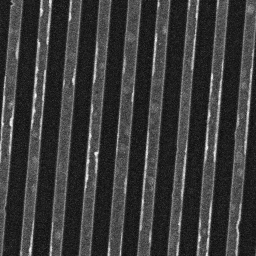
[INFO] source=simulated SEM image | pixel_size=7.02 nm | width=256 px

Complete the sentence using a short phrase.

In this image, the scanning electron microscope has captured parallel lines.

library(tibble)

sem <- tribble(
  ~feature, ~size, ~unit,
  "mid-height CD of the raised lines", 0.077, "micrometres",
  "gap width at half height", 0.129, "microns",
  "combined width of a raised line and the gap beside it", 206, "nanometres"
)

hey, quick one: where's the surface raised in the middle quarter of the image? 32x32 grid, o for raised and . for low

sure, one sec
ooo.....oo.....ooo....ooo.....oo
ooo.....oo.....ooo....ooo.....oo
ooo.....oo.....ooo....ooo.....oo
ooo....ooo.....ooo....ooo.....oo
ooo....ooo.....ooo....ooo.....oo
oo.....ooo.....oo.....ooo.....oo
oo.....ooo....ooo.....ooo....ooo
oo.....ooo....ooo.....ooo....ooo
oo.....ooo....ooo.....oo.....ooo
oo.....ooo....ooo.....oo.....ooo
oo.....oo.....ooo....ooo.....oo.
oo.....oo.....ooo....ooo.....oo.
oo.....oo.....ooo....ooo.....oo.
oo.....oo.....ooo....ooo.....oo.
oo.....oo.....ooo....ooo.....oo.
oo.....oo.....ooo....ooo.....oo.
oo....ooo.....ooo....ooo.....oo.
oo....ooo.....ooo....ooo.....oo.
o.....ooo....ooo.....ooo....ooo.
o.....ooo....ooo.....ooo....ooo.
o.....ooo....ooo.....oo.....ooo.
o.....ooo....ooo.....ooo....ooo.
o.....oo.....ooo.....oo.....oo..
o.....oo.....ooo....ooo.....oo..
o.....oo.....ooo....ooo.....oo..
o.....oo.....ooo....ooo.....oo..
o.....oo.....ooo....ooo.....oo..
o.....oo.....ooo....ooo.....oo..
o....ooo.....ooo....ooo.....oo..
o....ooo.....ooo....ooo.....oo..
.....ooo....ooo.....ooo....ooo..
.....ooo....ooo.....ooo....ooo..